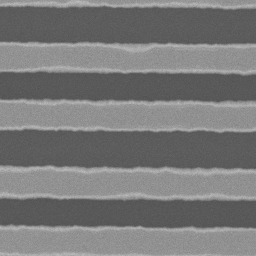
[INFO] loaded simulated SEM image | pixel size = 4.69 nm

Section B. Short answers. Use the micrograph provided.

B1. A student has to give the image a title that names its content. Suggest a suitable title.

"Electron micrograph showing lines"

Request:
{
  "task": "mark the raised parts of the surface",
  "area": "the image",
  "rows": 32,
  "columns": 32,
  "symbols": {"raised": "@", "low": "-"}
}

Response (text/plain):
@@@@@@@@@@@@@@@@@@@@@@@@@@@@@@@@
--------------------------------
--------------------------------
--------------------------------
--------------------------------
@@@@@-@@@@@@@-------------------
@@@@@@@@@@@@@@@@@@@@@@@@@@@@@@@@
@@@@@@@@@@@@@@@@@@@@@@@@@@@@@@@@
@@@@@@@@@@@@@@@@@@@@@@@@@@@@@@@@
--------------------------------
--------------------------------
--------------------------------
--@-----------------------------
@@@@@@@@@@@@@@@@@@@@@@@@@@@@@@@@
@@@@@@@@@@@@@@@@@@@@@@@@@@@@@@@@
@@@@@@@@@@@@@@@@@@@@@@@@@@@@@@@@
--------------------------------
--------------------------------
--------------------------------
--------------------------------
--------------------------------
@@@@@@@@@@@@@@@@@@@@@@@@@@@@@@@@
@@@@@@@@@@@@@@@@@@@@@@@@@@@@@@@@
@@@@@@@@@@@@@@@@@@@@@@@@@@@@@@@@
@@@@@@@@@@@@@@@@@@@@@@@@@@@@@@@@
--------------------------------
--------------------------------
--------------------------------
@@@@@@@@@@@@@@@@@@----------@---
@@@@@@@@@@@@@@@@@@@@@@@@@@@@@@@@
@@@@@@@@@@@@@@@@@@@@@@@@@@@@@@@@
@@@@@@@@@@@@@@@@@@@@@@@@@@@@@@@@